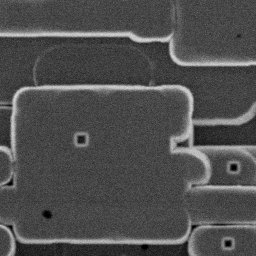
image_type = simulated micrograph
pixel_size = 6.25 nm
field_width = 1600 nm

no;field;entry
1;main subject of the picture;wiring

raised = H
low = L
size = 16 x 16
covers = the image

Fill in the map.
HHHHHHHHHHHHHHHH
HHHHHHHHHHHHHHHH
LLLLLLLLLHHHHHHH
LLLLLLLLLLLHHHHH
LLLLLLLLLLLLLLLL
LLHHHHHHHHHLLLLL
LHHHHHHHHHHHLLLL
LHHHHHHHHHHHLLLL
LHHHHHHHHHHHLLLL
HHHHHHHHHHHHLLLL
HHHHHHHHHHHHHLLL
HHHHHHHHHHHHHLLL
HHHHHHHHHHHHHHHH
HHHHHHHHHHHHHHHH
HHHHHHHHHHHHHHHH
HLLLLLLLLLLLHHHH